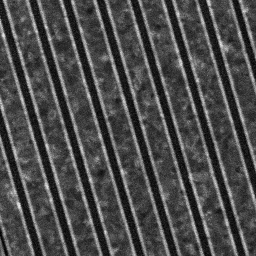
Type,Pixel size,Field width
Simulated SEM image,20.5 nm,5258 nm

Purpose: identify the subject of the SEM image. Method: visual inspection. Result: parallel lines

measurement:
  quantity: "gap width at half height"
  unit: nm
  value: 217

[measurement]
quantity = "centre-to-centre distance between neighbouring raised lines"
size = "668 nanometers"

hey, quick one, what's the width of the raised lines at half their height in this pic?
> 0.451 um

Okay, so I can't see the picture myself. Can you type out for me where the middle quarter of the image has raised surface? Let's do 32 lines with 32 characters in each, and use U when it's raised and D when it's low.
UUUUDDDUUUUUDDDUUUUUUDDDUUUUUDDD
UUUUDDDUUUUUUDDDUUUUUDDDUUUUUUDD
UUUUUDDUUUUUUDDDUUUUUDDDUUUUUUDD
UUUUUDDDUUUUUDDDUUUUUUDDDUUUUUDD
UUUUUDDDUUUUUUDDUUUUUUDDDUUUUUDD
UUUUUDDDUUUUUUDDDUUUUUDDDUUUUUUD
UUUUUUDDDUUUUUDDDUUUUUUDDUUUUUUD
UUUUUUDDDUUUUUDDDUUUUUUDDDUUUUUD
DUUUUUDDDUUUUUUDDDUUUUUDDDUUUUUU
DUUUUUUDDUUUUUUDDDUUUUUDDDUUUUUU
DUUUUUUDDDUUUUUDDDUUUUUUDDDUUUUU
DDUUUUUDDDUUUUUUDDUUUUUUDDDUUUUU
DDUUUUUDDDUUUUUUDDDUUUUUDDDUUUUU
DDUUUUUUDDDUUUUUDDDUUUUUUDDUUUUU
DDUUUUUUDDDUUUUUUDDUUUUUUDDDUUUU
DDDUUUUUDDDUUUUUUDDDUUUUUDDDUUUU
DDDUUUUUUDDUUUUUUDDDUUUUUUDDUUUU
DDDUUUUUUDDDUUUUUDDDUUUUUUDDDUUU
UDDDUUUUUDDDUUUUUUDDUUUUUUDDDUUU
UDDDUUUUUUDDUUUUUUDDDUUUUUDDDUUU
UDDDUUUUUUDDDUUUUUDDDUUUUUUDDUUU
UUDDUUUUUUDDDUUUUUUDDUUUUUUDDDUU
UUDDDUUUUUDDDUUUUUUDDDUUUUUDDDUU
UUDDDUUUUUUDDUUUUUUDDDUUUUUUDDUU
UUUDDUUUUUUDDDUUUUUDDDUUUUUUDDDU
UUUDDDUUUUUDDDUUUUUUDDUUUUUUDDDU
UUUDDDUUUUUUDDUUUUUUDDDUUUUUDDDU
UUUDDDUUUUUUDDDUUUUUDDDUUUUUUDDU
UUUUDDUUUUUUDDDUUUUUUDDUUUUUUDDD
UUUUDDDUUUUUDDDUUUUUUDDDUUUUUDDD
UUUUDDDUUUUUUDDUUUUUUDDDUUUUUUDD
UUUUUDDUUUUUUDDDUUUUUDDDUUUUUUDD